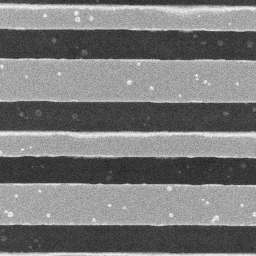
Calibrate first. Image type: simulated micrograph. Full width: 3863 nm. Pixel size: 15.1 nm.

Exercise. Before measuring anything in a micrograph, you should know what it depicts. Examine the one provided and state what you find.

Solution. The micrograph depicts lines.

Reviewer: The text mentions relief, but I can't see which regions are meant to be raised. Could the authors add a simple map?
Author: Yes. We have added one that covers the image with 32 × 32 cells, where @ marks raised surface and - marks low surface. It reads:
--------------------------------
@@@@@@@@@@@@@@@@@@@@@@@@@@@@@@@@
@@@@@@@@@@@@@@@@@@@@@@@@@@@@@@@@
@@@@@@@@@@@@@@@@@@@@@@@@@@@@@@@@
--------------------------------
--------------------------------
--------------------------------
@@@@@@@@@@@@@@@@@@@@--@-@@@@@---
@@@@@@@@@@@@@@@@@@@@@@@@@@@@@@@@
@@@@@@@@@@@@@@@@@@@@@@@@@@@@@@@@
@@@@@@@@@@@@@@@@@@@@@@@@@@@@@@@@
@@@@@@@@@@@@@@@@@@@@@@@@@@@@@@@@
@@@@@@@@@@@@@@@@@@@@@@@@@@@@@@@@
--------------------------------
--------------------------------
--------------------------------
@@@@--@@------------------------
@@@@@@@@@@@@@@@@@@@@@@@@@@@@@@@@
@@@@@@@@@@@@@@@@@@@@@@@@@@@@@@@@
@@@-@@@@-@@@@@@@@@@@@@@@@@@@@@@@
--------------------------------
--------------------------------
--------------------------------
@@@@@@@@@@@@@@@@@@@@@@@@@@@@@@@@
@@@@@@@@@@@@@@@@@@@@@@@@@@@@@@@@
@@@@@@@@@@@@@@@@@@@@@@@@@@@@@@@@
@@@@@@@@@@@@@@@@@@@@@@@@@@@@@@@@
@@@@@@@@@@@@@@@@@@@@@@@@@@@@@@@@
--------------------------------
--------------------------------
--------------------------------
--------------------------------